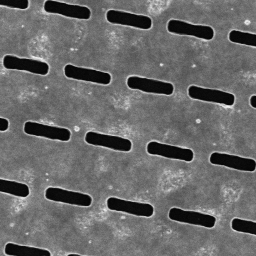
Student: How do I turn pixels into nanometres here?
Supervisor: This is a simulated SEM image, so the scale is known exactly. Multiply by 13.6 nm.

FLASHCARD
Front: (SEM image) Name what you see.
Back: a regular array of holes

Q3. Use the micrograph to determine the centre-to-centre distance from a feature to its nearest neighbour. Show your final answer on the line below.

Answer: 845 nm